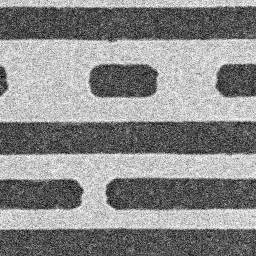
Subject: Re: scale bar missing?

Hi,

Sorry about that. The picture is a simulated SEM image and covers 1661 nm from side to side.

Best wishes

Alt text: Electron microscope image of parallel lines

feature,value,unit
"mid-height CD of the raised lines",0.14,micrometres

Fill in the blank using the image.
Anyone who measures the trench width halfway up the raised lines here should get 227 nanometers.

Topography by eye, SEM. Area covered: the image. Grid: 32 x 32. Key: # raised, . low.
################################
................................
................................
................................
................................
################################
################################
################################
.##########........########.....
.##########.........#######.....
.##########.........#######.....
.##########.........#######.....
################################
################################
################################
................................
................................
................................
................................
......######################...#
################################
################################
..........####..................
..........###...................
..........###...................
..........###...................
################################
################################
########........................
................................
................................
................................